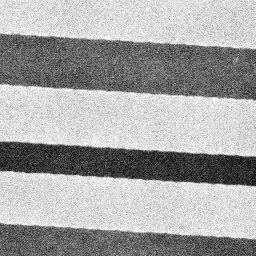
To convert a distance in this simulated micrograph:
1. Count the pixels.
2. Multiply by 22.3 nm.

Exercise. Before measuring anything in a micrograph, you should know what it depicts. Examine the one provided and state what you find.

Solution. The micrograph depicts lines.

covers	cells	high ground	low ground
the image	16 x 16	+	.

++++++++++++++++
++++++++++++++++
.......+++++++++
................
................
+++.............
++++++++++++++++
++++++++++++++++
++++++++++++++++
...........+++++
................
++++++++++++++..
++++++++++++++++
++++++++++++++++
.........+++++++
................